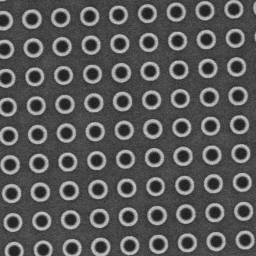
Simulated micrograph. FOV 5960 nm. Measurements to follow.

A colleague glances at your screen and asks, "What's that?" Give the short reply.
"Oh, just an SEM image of an array of small figures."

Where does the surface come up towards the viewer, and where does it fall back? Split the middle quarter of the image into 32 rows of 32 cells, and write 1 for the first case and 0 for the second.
00000011000001110000111000011110
11000111100011111001111100111110
11000111100011111001111100011110
11000111100011110000111000011100
10000011000000100000000000000000
00000000000000000000000000000000
00000000000000000000000000001100
00000001000001110000111100011110
11000011110011111000111100011110
11000111110011111000111100011110
11000111110001111000111100001110
11000011100000110000000000000000
00000000000000000000000000000000
00000000000000000000000000000000
00000000000000110000011100001110
11000011110001111000111100011111
11100111110001111000111100011111
11100111110001111000111100001110
11100011110000110000011000000000
10000000000000000000000000000000
00000000000000000000000000000000
00000000000000000000011100001110
11000011110001111000111110011111
11100011110001111100111110011111
11100011110001111100011110001111
11100011110000111000011100000000
11000000000000000000000000000000
00000000000000000000000000000000
00000000000000000000001100000111
11000001110000111000011110001111
11100011111001111100011110001111
11110011111001111100011110001111